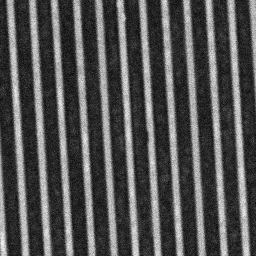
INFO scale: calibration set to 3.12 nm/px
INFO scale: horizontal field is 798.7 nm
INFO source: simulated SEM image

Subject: parallel lines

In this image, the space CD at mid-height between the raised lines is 47.8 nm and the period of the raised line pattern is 68.7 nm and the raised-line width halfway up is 20.6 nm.